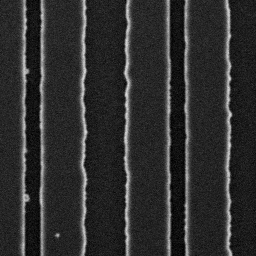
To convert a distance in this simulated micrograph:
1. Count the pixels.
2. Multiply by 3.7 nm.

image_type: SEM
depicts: lines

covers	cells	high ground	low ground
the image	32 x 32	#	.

###..######.....#####..######...
###..######.....#####..######...
###..######.....#####..######...
###..######.....#####..######...
###..######.....#####..######...
###..######.....#####..######...
###..######.....#####..######...
###..######.....#####..######...
###..######.....#####..######...
###..######.....#####..######...
###..#####......#####..######...
###..#####......#####..######...
###..#####......#####..######...
###..######.....#####..######...
###..######.....#####..######...
###..######.....#####..######...
###..######.....#####..######...
###..######.....#####..######...
###..######.....#####..######...
###..######.....#####..######...
###..#####......#####..######...
###..######.....#####..######...
###..######.....#####..######...
###..######.....#####..######...
###..######.....#####..######...
###..######.....#####..######...
###..######.....#####..######...
###..######.....#####..######...
###..######.....#####..######...
###..######.....#####..######...
###..######.....#####..######...
###..######.....#####..######...